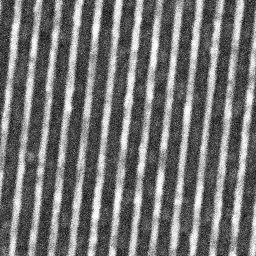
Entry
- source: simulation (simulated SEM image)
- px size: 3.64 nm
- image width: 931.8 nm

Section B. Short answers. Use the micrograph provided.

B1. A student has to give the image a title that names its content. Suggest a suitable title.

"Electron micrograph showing parallel lines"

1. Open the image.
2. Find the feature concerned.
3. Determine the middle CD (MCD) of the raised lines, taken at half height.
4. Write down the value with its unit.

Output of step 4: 19 nanometers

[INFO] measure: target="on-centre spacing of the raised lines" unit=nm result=72.7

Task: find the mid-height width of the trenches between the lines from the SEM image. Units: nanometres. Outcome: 53.8